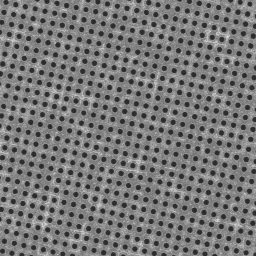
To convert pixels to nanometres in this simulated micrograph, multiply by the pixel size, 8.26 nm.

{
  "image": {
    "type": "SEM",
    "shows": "a regular array of holes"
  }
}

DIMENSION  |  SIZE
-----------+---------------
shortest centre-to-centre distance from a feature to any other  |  0.0811 µm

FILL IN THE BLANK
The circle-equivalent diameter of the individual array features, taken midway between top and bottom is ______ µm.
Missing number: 0.0437